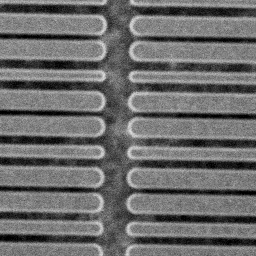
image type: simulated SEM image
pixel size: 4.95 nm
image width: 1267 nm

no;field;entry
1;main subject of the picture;groups of lines, slits or small figures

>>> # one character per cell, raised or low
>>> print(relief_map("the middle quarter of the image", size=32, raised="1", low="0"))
00000000000000000000000000000000
00000000000000000000000000000000
11111111110000000111111111111111
11111111110000000111111111111111
00000000000000000000000000000000
00000000000000000000000000000000
00000000000000000000000000000000
11111111100000000011111111110000
11111111110000000111111111111111
11111111110000001111111111111111
11111111110000000111111111111111
00011111000000000011111111111111
00000000000000000000000000000000
11111100000000000000000000000000
11111111110000000111111111111111
11111111110000001111111111111111
11111111110000001111111111111111
11111111100000000111111111111111
00000000000000000000000000000000
00000000000000000000000000000000
00000000000000000000000000000000
11111111110000001111111111111111
11111111110000001111111111111111
00000000000000000111111111111111
00000000000000000000000000000000
00000000000000000000000000000000
11111111100000000011000000000000
11111111100000001111111111111111
11111111110000001111111111111111
11111111100000001111111111111111
11111111000000000111111111111111
00000000000000000000000000000000